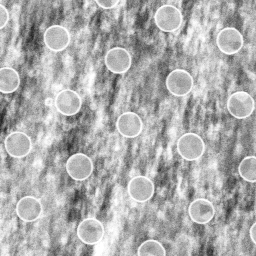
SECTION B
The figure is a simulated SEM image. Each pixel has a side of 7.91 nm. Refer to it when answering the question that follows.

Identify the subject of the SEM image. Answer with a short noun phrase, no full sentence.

a regular array of raised bodies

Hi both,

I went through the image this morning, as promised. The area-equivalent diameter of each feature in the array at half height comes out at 201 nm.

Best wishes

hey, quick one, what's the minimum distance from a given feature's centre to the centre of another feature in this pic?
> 516 nanometres